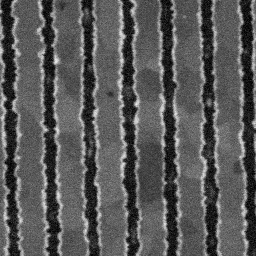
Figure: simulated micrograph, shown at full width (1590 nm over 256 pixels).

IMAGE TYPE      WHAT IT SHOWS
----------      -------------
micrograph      parallel lines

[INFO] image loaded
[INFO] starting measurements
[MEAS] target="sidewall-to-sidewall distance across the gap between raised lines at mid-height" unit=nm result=79.2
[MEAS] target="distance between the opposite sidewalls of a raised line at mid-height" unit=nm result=172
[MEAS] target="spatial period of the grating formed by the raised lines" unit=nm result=247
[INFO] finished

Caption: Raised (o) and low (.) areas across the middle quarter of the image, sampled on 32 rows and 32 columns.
ooooo..ooooooo...ooooooo...ooooo
ooooo..ooooooo....ooooooo..ooooo
ooooo...oooooo....ooooooo...oooo
ooooo...ooooooo..ooooooo....oooo
ooooo...oooooo....ooooooo...oooo
ooooo...oooooo...oooooooo...oooo
ooooo...oooooo....ooooooo...oooo
ooooo..ooooooo....oooooo....oooo
ooooo...oooooo.....ooooo...ooooo
ooooo...ooooooo...ooooooo..ooooo
ooooo...ooooooo...ooooooo...oooo
oooo....oooooo.....oooooo..ooooo
oooo....oooooo....ooooooo...oooo
oooo....ooooooo...ooooooo...oooo
ooooo...ooooooo...ooooooo...oooo
ooooo...oooooo....ooooooo...oooo
ooooo...ooooooo...ooooooo...oooo
ooooo...ooooooo...ooooooo...oooo
ooooo...ooooooo...ooooooo...oooo
ooooo...ooooooo...ooooooo...oooo
ooooo...ooooooo...ooooooo...oooo
ooooo...oooooooo..ooooooo...oooo
ooooo...ooooooo...ooooooo...oooo
ooooo...ooooooo....oooooo...oooo
ooooo...ooooooo...ooooooo...oooo
ooooo...ooooooo...ooooooo...oooo
oooooo..ooooooo...ooooooo....ooo
ooooo...ooooooo...ooooooo....ooo
ooooo...ooooooo...ooooooo...oooo
ooooo...ooooooo....oooooo...oooo
ooooo...ooooooo....oooooo...oooo
ooooo....oooooo...ooooooo...oooo